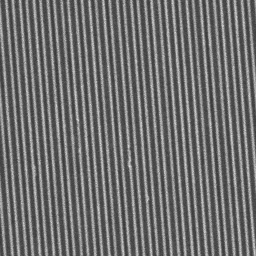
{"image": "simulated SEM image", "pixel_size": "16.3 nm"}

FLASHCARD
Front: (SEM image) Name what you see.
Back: parallel lines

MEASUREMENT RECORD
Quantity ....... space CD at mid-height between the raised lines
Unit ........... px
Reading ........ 4.24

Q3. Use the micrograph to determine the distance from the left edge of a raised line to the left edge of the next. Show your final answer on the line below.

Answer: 112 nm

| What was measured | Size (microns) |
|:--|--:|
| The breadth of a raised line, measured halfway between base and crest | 0.0406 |